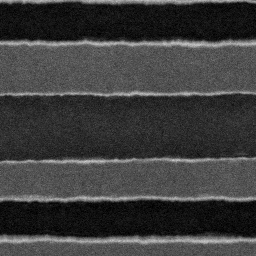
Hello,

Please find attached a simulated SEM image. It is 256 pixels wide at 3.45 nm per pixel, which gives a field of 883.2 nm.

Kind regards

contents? lines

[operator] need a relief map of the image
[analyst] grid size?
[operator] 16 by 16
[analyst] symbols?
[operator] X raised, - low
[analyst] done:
----------------
----------------
----------------
XXXXXXXXXXXXXXXX
XXXXXXXXXXXXXXXX
XXXXXXXXXXXXXXXX
----------------
----------------
----------------
----------------
XXXXXXXXXXXXXXXX
XXXXXXXXXXXXXXXX
-XXXX---------X-
----------------
----------------
XXXXXXXXXXXXXXXX